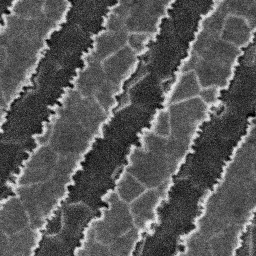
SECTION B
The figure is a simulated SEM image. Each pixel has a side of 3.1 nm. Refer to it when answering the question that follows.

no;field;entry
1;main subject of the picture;one or a few lines or trenches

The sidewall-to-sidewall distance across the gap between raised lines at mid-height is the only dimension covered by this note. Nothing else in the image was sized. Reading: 39.5 px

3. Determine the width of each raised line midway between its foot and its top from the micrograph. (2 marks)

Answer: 143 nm